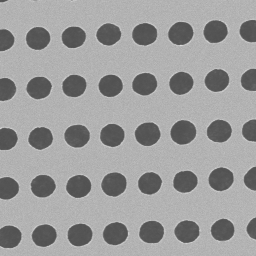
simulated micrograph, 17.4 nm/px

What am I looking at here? a regular array of holes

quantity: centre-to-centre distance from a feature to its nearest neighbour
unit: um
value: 0.617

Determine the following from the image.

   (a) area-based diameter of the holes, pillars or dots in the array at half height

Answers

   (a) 416 nm